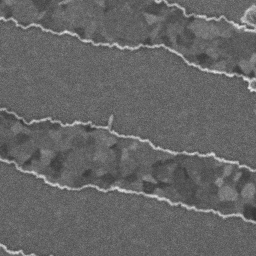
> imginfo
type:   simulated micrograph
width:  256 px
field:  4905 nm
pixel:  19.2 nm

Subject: one or a few lines or trenches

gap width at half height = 1620 nanometres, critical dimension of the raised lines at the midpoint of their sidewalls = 1000 nanometres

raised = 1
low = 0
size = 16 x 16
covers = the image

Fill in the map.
1111111111100000
0111111111111110
0000011111111111
0000000000011111
0000000000000111
0000000000000000
0000000000000000
1010000000000000
1111111100000000
1111111111100000
0111111111111111
0001111111111111
0000000000111111
0000000000000001
0000000000000000
0000000000000000